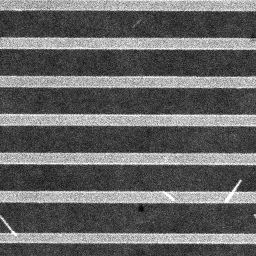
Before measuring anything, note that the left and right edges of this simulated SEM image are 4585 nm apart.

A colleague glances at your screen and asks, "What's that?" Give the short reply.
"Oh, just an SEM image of parallel lines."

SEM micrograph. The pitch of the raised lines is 38.9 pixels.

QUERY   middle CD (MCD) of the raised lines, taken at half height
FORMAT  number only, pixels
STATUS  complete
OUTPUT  10.2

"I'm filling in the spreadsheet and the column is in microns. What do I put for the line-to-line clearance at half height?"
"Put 0.501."